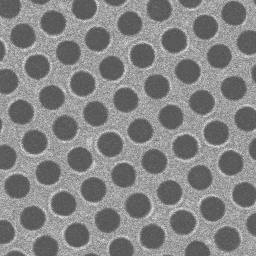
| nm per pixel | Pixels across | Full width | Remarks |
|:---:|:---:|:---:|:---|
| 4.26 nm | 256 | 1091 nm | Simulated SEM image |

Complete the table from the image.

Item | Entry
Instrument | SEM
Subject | a regular array of holes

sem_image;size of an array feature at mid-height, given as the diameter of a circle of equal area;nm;102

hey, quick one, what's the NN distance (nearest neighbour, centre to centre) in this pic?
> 142 nm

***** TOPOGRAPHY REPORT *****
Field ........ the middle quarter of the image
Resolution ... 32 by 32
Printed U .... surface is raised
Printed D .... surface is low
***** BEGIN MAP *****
UUUUUUUUUDDDDDDUUUDDDUUUUUUUDDDD
UUUUUUUUUDDDDDDUUUUUUUUUUUUUDDDD
UUUDDDUUUDDDDDDUUUUUUUUUUUUUDDDD
UUDDDDDUUUDDDDUUUUUUUDDDDUUUUDDD
UUDDDDDDUUUUUUUUUUUUDDDDDDUUUUDD
UUDDDDDDUUUUUUUUUUUUDDDDDDUUUUUU
UUDDDDDUUUUUUUDDDUUUDDDDDDUUUUUU
UUUDDDUUUUUUUDDDDDUUUDDDDDUUUUUU
UUUUUUUUUUUUDDDDDDUUUUDDUUUUUUUU
UUUUUUUDDUUUDDDDDDUUUUUUUUUUUUUD
UUUUUUDDDDUUUDDDDDUUUUUUUUDDUUUD
UUUUUDDDDDDUUUDDDUUUUUUUDDDDDUUU
UUUUUDDDDDDUUUUUUUUUUUUUDDDDDDUU
DDUUUDDDDDDUUUUUUUUUUUUUDDDDDDUU
DDDUUUDDDDUUUUUUUDDDDUUUDDDDDUUU
DDDUUUUUUUUUUUUUDDDDDDUUUDDDDUUU
DDDUUUUUUUUUUUUUDDDDDDUUUUUUUUUU
DDDUUUUUUUDDDUUUDDDDDDUUUUUUUUUU
DDUUUUUUUDDDDDUUUDDDDDUUUUUUDDDD
UUUUUUUUDDDDDDDUUUDDUUUUUUUUDDDD
UUUUUUUUDDDDDDDUUUUUUUUUUUUDDDDD
UUDDDDUUUDDDDDUUUUUUUDDUUUUDDDDD
UDDDDDDUUUDDDUUUUUUUDDDDDUUUDDDD
UDDDDDDUUUUUUUUUUUUUDDDDDDUUUDDU
UDDDDDDUUUUUUUUUUUUDDDDDDDUUUUUU
UUDDDDDUUUUUUDDDDUUUDDDDDUUUUUUU
UUUDDUUUUUUUDDDDDDUUDDDDDUUUUUUU
UUUUUUUUUUUUDDDDDDUUUUUUUUUUUUUD
UUUUUUUDUUUUDDDDDDUUUUUUUUUUUUUD
UUUUUDDDDDUUDDDDDUUUUUUUUDDDUUUD
UUUUUDDDDDUUUDDDDUUUUUUUDDDDDUUU
UUUUDDDDDDUUUUUUUUUUUUUDDDDDDUUU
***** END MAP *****